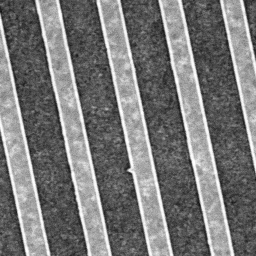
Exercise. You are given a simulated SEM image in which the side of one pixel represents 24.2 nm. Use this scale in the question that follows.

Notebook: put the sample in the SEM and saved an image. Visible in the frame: parallel lines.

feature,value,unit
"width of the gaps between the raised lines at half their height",990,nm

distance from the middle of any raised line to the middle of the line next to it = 1460 nm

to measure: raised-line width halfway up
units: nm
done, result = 483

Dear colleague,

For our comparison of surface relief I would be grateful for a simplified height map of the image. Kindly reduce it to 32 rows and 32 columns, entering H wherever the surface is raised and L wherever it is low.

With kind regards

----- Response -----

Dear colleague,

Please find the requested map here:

LLLLLHHLLLLLHHHLLLLLHHHLLLLLHHLL
LLLLLHHLLLLLLHHLLLLLHHHLLLLLHHLL
LLLLLHHHLLLLLHHLLLLLLHHLLLLLHHHL
LLLLLHHHLLLLLHHHLLLLLHHLLLLLHHHL
LLLLLHHHLLLLLHHHLLLLLHHLLLLLLHHL
HLLLLLHHLLLLLHHHLLLLLHHHLLLLLHHL
HLLLLLHHLLLLLLHHLLLLLHHHLLLLLHHL
HLLLLLHHHLLLLLHHLLLLLHHHLLLLLHHH
HLLLLLHHHLLLLLHHHLLLLLHHLLLLLHHH
HLLLLLLHHLLLLLHHHLLLLLHHLLLLLLHH
HHLLLLLHHLLLLLHHHLLLLLHHHLLLLLHH
HHLLLLLHHHLLLLLHHLLLLLHHHLLLLLHH
HHLLLLLHHHLLLLLHHLLLLLLHHLLLLLHH
HHLLLLLHHHLLLLLHHHLLLLLHHLLLLLHH
HHLLLLLLHHLLLLLHHHLLLLLHHLLLLLLH
HHHLLLLLHHLLLLLHHHLLLLLHHHLLLLLH
HHHLLLLLHHHLLLLLHHLLLLLHHHLLLLLH
LHHLLLLLHHHLLLLLHHLLLLLLHHLLLLLH
LHHLLLLLHHHLLLLLHHHLLLLLHHLLLLLH
LHHHLLLLLHHLLLLLHHHLLLLLHHHLLLLL
LHHHLLLLLHHLLLLLHHHLLLLLHHHLLLLL
LHHHLLLLLHHHLLLLLHHLLLLLHHHLLLLL
LLHHLLLLLHHHLLLLLHHLLLLLLHHLLLLL
LLHHLLLLLLHHLLLLLHHHLLLLLHHLLLLL
LLHHHLLLLLHHLLLLLHHHLLLLLHHHLLLL
LLHHHLLLLLHHLLLLLLHHLLLLLHHHLLLL
LLHHHLLLLLHHHLLLLLHHLLLLLLHHLLLL
LLLHHLLLLLHHHLLLLLHHLLLLLLHHLLLL
LLLHHLLLLLLHHLLLLLHHHLLLLLHHLLLL
LLLHHHLLLLLHHLLLLLHHHLLLLLHHHLLL
LLLHHHLLLLLHHLLLLLLHHLLLLLHHHLLL
LLLHHHLLLLLHHHLLLLLHHLLLLLLHHLLL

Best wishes